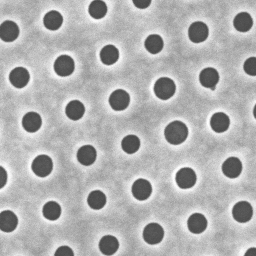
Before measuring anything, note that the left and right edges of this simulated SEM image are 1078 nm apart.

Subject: a regular array of holes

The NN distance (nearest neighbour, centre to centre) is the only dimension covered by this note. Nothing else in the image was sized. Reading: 192 nm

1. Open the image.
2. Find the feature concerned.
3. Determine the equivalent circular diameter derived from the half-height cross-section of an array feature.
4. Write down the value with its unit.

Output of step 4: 0.0892 um